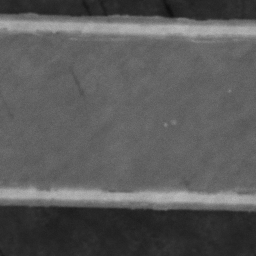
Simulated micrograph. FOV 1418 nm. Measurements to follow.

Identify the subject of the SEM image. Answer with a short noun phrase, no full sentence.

one or a few lines or trenches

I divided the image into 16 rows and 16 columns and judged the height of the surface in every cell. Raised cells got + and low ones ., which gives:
................
................
++++++++++++++++
++++++++++++++++
++++++++++++++++
++++++++++++++++
++++++++++++++++
++++++++++++++++
++++++++++++++++
++++++++++++++++
++++++++++++++++
++++++++++++++++
................
................
................
................